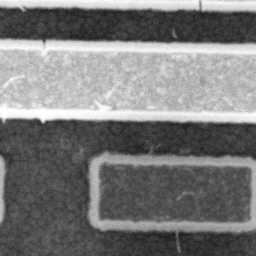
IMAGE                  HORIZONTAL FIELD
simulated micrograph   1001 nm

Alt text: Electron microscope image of one or a few lines or trenches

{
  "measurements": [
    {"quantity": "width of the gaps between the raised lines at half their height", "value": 169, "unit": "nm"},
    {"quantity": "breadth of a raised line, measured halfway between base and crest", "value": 264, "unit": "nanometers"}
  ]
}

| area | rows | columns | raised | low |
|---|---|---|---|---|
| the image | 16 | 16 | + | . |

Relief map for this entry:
................
................
................
++++++++++++++++
++++++++++++++++
++++++++++++++++
++++++++++++++++
................
................
................
......++++++++++
......++++++++++
......++++++++++
......++++++++++
................
................